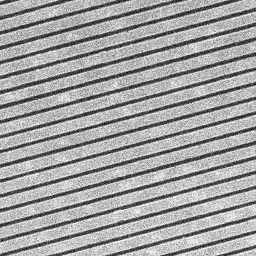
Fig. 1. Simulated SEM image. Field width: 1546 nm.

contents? parallel lines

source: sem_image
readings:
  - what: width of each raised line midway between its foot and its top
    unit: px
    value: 9.9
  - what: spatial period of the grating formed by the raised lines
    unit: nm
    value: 86.5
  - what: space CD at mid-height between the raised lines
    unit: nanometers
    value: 27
